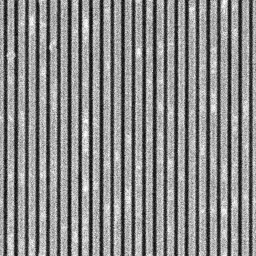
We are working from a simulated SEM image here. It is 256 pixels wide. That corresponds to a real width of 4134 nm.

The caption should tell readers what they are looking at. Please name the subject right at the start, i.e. parallel lines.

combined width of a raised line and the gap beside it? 172 nanometers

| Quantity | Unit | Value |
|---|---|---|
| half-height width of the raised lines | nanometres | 103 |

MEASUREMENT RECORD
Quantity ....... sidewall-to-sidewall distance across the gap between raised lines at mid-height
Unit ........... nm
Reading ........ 72.7